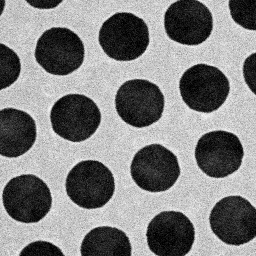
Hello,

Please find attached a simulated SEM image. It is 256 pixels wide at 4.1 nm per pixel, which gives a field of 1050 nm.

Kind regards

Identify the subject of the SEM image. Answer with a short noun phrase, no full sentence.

a regular array of holes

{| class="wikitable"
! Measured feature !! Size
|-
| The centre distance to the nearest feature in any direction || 271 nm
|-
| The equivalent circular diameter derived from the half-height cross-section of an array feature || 0.203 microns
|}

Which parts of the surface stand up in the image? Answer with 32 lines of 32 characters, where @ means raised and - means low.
-@@@---@@@@@@@@@@@@@@@---@@@@---
@@@@@@@@@@@@@@@@@@@@@-----@@@---
@@@@@@@@@@@@@-----@@-------@@---
@@@@@@--@@@@@------@@------@@@@-
@@@@@-----@@-------@@-----@@@@@@
@@@@@-----@@-------@@@@--@@@@@@@
--@@-------@@-----@@@@@@@@@@@@@@
--@@------@@@@---@@@@@@@@@@@@@@-
---@@-----@@@@@@@@@@@@@@---@@@--
--@@@@@@@@@@@@@@@@@@@@@-----@@--
--@@@@@@@@@@@@@----@@@-------@@-
@@@@@@@@@@@@@@@-----@@-------@@@
@@@@@@@----@@@-------@@-----@@@@
@@@@@@------@@@-----@@@@---@@@@@
----@@-------@@-----@@@@@@@@@@@@
----@@------@@@@---@@@@@@@@@@@@@
-----@@-----@@@@@@@@@@@@@@---@@@
----@@@@---@@@@@@@@@@@@@@-----@@
----@@@@@@@@@@@@@@---@@@------@@
---@@@@@@@@@@@@@@-----@@------@@
@@@@@@@@@@---@@@------@@@-----@@
@@@@@@@@@-----@@-------@@----@@@
@----@@@------@@@-----@@@@@@@@@@
@-----@@------@@@@---@@@@@@@@@@@
------@@@-----@@@@@@@@@@@@@@@-@@
------@@@----@@@@@@@@@@@@@@----@
@-----@@@@@@@@@@@@@@--@@@@------
@@---@@@@@@@@@@@@@@-----@@------
@@@@@@@@@@@@--@@@@------@@------
@@@@@@@@@@@-----@@------@@@-----
@@@@---@@@------@@------@@@@--@@
@@@-----@@------@@@-----@@@@@@@@